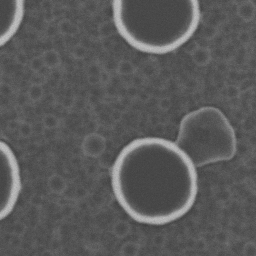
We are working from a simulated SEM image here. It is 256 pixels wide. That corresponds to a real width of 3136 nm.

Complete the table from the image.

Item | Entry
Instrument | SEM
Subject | raised bodies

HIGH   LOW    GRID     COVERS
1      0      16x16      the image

1000000111110000
1000000111110000
0000000011100000
0000000000000000
0000000000000000
0000000000000000
0000000000000000
0000000000000000
0000000000000000
0000000011100000
1000000111110000
1000000111110000
1000000011110000
0000000001100000
0000000000000000
0000000000000000